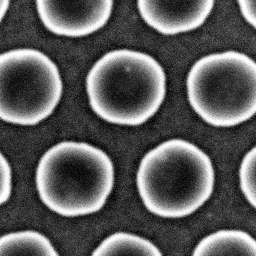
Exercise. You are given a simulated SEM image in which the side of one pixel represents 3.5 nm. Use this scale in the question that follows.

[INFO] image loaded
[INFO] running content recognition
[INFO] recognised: raised bodies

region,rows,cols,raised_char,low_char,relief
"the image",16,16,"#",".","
..#####..####..#
...###...###....
................
###....##.....#.
####..####..####
####..####..####
###...####..####
.#.....##....##.
................
...###....##....
..#####..####..#
#.#####..####..#
...###...####...
................
................
###...####..####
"